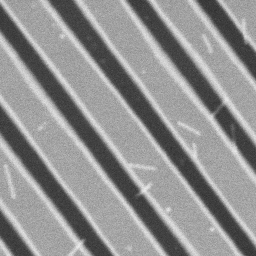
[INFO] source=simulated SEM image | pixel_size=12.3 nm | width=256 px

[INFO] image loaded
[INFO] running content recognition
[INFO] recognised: lines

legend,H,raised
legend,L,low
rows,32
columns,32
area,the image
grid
HHHHHHLLLLHHHHHHLLLHHHHHHLLHHHHH
LHHHHHHLLLHHHHHHHLLLHHHHHHLLHHHH
LLHHHHHHLLLHHHHHHHLLHHHHHHLLLHHH
LLHHHHHHHLLLHHHHHHLLLHHHHHHLLLHH
LLLHHHHHHLLLLHHHHHHLLLHHHHHHLLHH
HLLLHHHHHHLLLHHHHHHHLLLHHHHHHLLH
HHLLLHHHHHHLLLHHHHHHLLLHHHHHHLLL
HHHLLHHHHHHHLLLHHHHHHLLLHHHHHHLL
HHHLLLHHHHHHLLLLHHHHHHLLLHHHHHHL
HHHHLLLHHHHHHLLLHHHHHHHLLLHHHHHL
HHHHHLLLHHHHHHLLLHHHHHHLLLHHHHHH
HHHHHHLLHHHHHHHLLLHHHHHHLLLHHHHH
HHHHHHLLLHHHHHHHLLHHHHHHHLLLHHHH
HHHHHHHLLLHHHHHHLLLHHHHHHHLLLHHH
LHHHHHHHLLLHHHHHHLLLHHHHHHHLLHHH
LLHHHHHHHLLHHHHHHHLLLHHHHHHLLLHH
LLLHHHHHHLLLHHHHHHHLLHHHHHHHLLLH
LLLHHHHHHHLLLHHHHHHLLLHHHHHHHLLL
HLLLHHHHHHHLLLHHHHHHLLLHHHHHHHLL
HHLLLHHHHHHHLLHHHHHHHLLLHHHHHHLL
HHHLLLHHHHHHLLLHHHHHHHLLHHHHHHHL
HHHHLLHHHHHHHLLLHHHHHHLLLHHHHHHH
HHHHLLLHHHHHHHLLLHHHHHHLLLHHHHHH
HHHHHLLLHHHHHHHLLHHHHHHHLLHHHHHH
HHHHHHLLLHHHHHHLLLHHHHHHHLLHHHHH
HHHHHHHLLHHHHHHHLLLHHHHHHLLLHHHH
HHHHHHHLLLHHHHHHHLLLHHHHHHLLLHHH
LHHHHHHHLLLHHHHHHHLLHHHHHHHLLHHH
LLHHHHHHHLLLHHHHHHLLLHHHHHHHLLHH
LLLHHHHHHHLLHHHHHHHLLLHHHHHHHLLH
HLLHHHHHHHLLLHHHHHHHLLLHHHHHHLLL
HLLLHHHHHHHLLLHHHHHHHLLHHHHHHHLL